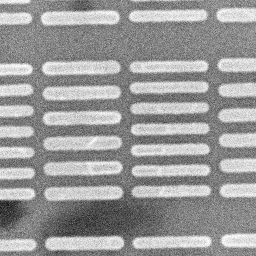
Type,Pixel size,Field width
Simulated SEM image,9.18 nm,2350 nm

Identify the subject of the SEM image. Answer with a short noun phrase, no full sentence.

groups of lines, slits or small figures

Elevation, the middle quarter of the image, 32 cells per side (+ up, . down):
++++++++++++++...+++++++++++++++
++++++++++++++...+++++++++++++++
................................
................................
................................
.................+++++++++++++++
++++++++++++++...+++++++++++++++
++++++++++++++..................
++++++..........................
................................
.................+++++++++++++++
.................+++++++++++++++
++++++++++++++..................
++++++++++++++..................
+++++++++++++...................
.................+++++++++++++++
.................+++++++++++++++
..................+++...........
....+++++++++...................
++++++++++++++..................
++++++++++++++.......+++++++++++
.................+++++++++++++++
.................++++++++++++.++
................................
................................
++++++++++++++...............+++
++++++++++++++...+++++++++++++++
+................+++++++++++++++
................................
................................
................................
++++++++++++++...+++++++++++++++